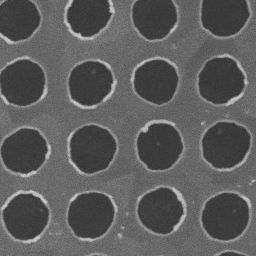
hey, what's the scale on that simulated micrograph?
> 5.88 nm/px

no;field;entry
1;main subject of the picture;a regular array of holes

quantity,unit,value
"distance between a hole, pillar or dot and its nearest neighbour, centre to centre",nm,382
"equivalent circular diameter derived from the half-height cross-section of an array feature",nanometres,276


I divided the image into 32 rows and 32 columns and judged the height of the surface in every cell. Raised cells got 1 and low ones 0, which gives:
00001111100000111000001110000001
00000111000000111000001110000001
00000111000000111000001110000001
00000111100001111000001111000011
10001111110011111100011111100111
11111111111111111111111111111111
11111111111111111111111111111111
11001111111111111110011111000111
10000111100000111000001110000011
00000011100000111000001110000001
00000011100000111000001110000001
00000111100000111000001110000011
10000111100001111100011111000111
11111111111111111111111111111111
11111111111111111111111111111111
11111111111111111110011111100011
11000111100000111100001111000001
00000011100000011000000110000001
00000011100000011000000110000001
00000011100000111000000110000001
00000111100000111100001111000011
11001111110011111111111111111111
11111111111111111111111111111111
11111111111111111111011111111111
11001111110001111100001111100011
10000011100000111000000111000001
00000011000000111000000110000001
00000011000000111000001110000001
10000011100000111100001110000001
10000111110001111111111111000011
11111111111111111111111111111111
11111111111111111111111111110011